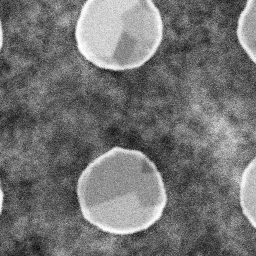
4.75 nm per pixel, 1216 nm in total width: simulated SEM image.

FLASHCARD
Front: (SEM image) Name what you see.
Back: raised bodies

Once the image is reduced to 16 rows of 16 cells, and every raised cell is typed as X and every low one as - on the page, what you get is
-----XXXXX-----X
-----XXXXX-----X
-----XXXXX-----X
-----XXXX-------
----------------
----------------
----------------
----------------
----------------
-------XX-------
-----XXXXX-----X
-----XXXXX-----X
-----XXXXX-----X
-----XXXXX-----X
-------X--------
----------------